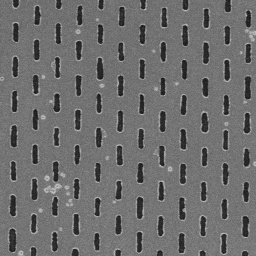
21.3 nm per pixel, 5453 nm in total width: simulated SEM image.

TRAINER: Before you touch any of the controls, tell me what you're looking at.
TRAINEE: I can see a regular array of holes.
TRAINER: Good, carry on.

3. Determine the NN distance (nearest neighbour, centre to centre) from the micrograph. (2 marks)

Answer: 575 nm